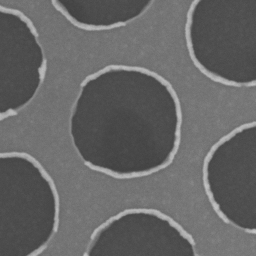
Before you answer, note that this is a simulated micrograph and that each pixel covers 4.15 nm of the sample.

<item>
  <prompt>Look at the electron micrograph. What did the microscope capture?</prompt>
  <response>holes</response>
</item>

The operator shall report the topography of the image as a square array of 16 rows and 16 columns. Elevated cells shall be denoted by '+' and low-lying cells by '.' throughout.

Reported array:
++++.....+++....
..+++..+++++....
..++++++++++....
...+++++++++....
..+++++..++++...
..+++.....++++++
..+++......+++++
++++.......+++++
+++++......++++.
+++++......++...
..+++++...+++...
...++++++++++...
...++++++++++...
...+++++..++++..
...+++.....+++++
..++++......++++